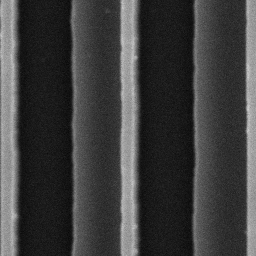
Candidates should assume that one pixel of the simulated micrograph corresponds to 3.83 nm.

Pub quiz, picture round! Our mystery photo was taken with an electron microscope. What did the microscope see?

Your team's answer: lines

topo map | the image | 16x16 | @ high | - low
@----@@@----@@@@
@---@@@@----@@@@
@----@@@----@@@@
@----@@@----@@@@
@----@@@----@@@@
@----@@@----@@@@
@----@@@----@@@@
@----@@@----@@@@
@----@@@----@@@@
@----@@@----@@@@
@----@@@----@@@@
@----@@@----@@@@
@----@@@----@@@@
@----@@@----@@@@
@----@@@----@@@@
@----@@@----@@@@